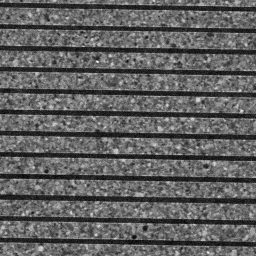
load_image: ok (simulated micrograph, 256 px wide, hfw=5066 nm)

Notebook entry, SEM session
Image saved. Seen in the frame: parallel lines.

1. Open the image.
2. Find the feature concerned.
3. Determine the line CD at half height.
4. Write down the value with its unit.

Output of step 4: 312 nm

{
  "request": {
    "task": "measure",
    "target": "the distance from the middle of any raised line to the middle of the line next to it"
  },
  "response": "422 nm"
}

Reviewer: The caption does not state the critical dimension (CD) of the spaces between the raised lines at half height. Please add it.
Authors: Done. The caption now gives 5.62 pixels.